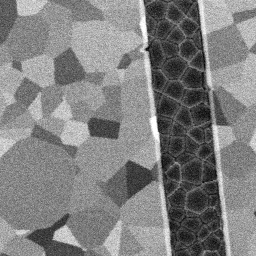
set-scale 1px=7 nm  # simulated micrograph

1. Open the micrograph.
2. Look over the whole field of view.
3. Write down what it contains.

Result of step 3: one or a few lines or trenches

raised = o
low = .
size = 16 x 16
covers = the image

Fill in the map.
ooooooooo....ooo
ooooooooo....ooo
ooooooooo....ooo
ooooooooo....ooo
ooooooooo....ooo
ooooooooo....ooo
oooooooooo...ooo
oooooooooo...ooo
oooooooooo...ooo
oooooooooo....oo
oooooooooo....oo
oooooooooo....oo
oooooooooo....oo
oooooooooo....oo
oooooooooo....oo
ooooooooooo...oo